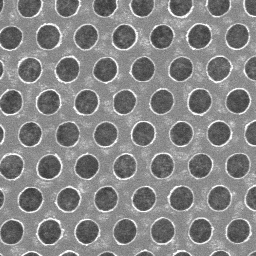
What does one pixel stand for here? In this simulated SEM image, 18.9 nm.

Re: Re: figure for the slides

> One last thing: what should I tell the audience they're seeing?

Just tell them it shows a regular array of holes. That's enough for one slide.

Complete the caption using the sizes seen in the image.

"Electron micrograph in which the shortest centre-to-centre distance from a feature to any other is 704 nm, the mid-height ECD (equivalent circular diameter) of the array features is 456 nanometres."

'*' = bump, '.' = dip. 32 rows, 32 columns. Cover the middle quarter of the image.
....****.....****......***......
....***......****......***......
....***......****.....****......
...*****.....*****....*****....*
.*********.*********************
********************************
*****.******************..******
***.....*****....*****.....*****
***......***......****.....****.
***......***......****.....****.
***.....****......****.....****.
***.....*****....*****.....****.
****...*******..********.*******
********************************
*.********.********..********.**
...*****.....*****....*****.....
....****.....****......****.....
....****......***......***......
....****.....****......****.....
...*****.....****.....*****....*
..********.********.*********.**
********************************
************************..******
****....*****.....*****....*****
***......****.....****.....****.
***......***......****.....****.
***......***......****.....****.
***.....*****....*****.....*****
*****..*******..*******...******
********************************
*****************************.**
...******....*****....*****.....